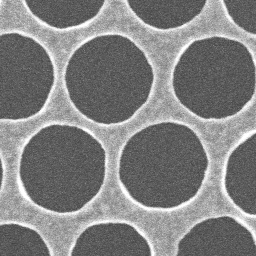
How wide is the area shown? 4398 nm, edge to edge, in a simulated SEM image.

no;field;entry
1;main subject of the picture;holes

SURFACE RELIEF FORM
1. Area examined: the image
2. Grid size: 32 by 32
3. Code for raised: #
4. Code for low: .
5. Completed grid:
###..........###..........##....
####........#####........###....
#####......#######......#####...
#######.###########...########..
....########...#################
.....#####.......#######......##
......###.........#####........#
......###.........####..........
.......#...........###..........
.......#...........###..........
.......#...........###..........
......##...........###..........
......###.........####.........#
.....#####.......######.......##
....#######......########....###
#############.#####....#########
#####......######.......########
####........####.........#####..
###..........##...........###...
###..........##...........###...
##...........##...........##....
##...........##...........##....
###..........##...........##....
###..........##..........###....
###.........####........####....
####.......######......######...
#######..#####################..
##########################....##
....#######......#######.......#
.....#####........#####.........
......###..........###..........
......###..........###..........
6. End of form